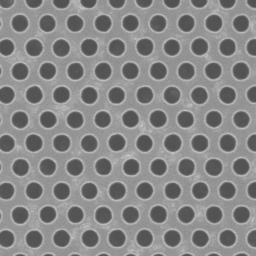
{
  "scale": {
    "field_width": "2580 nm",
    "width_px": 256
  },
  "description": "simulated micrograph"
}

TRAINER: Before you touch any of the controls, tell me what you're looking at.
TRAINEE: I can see a regular array of holes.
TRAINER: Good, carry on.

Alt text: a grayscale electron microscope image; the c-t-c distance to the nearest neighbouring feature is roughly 272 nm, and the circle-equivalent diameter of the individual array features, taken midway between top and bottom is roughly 165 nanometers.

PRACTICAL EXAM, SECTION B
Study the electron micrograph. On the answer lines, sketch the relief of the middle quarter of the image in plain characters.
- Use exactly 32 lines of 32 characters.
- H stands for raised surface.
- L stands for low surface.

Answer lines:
HLLLHHHHLLLLHHHLLLHHHHLLLHHHHLLL
HLLLLHHHLLLLHHLLLLLHHHLLLLHHHLLL
HLLLLHHHLLLLHHHLLLHHHHLLLLHHHLLL
HHLLHHHHHLLHHHHHLLHHHHLLLHHHHLLL
HHHHHHHHHHHHHHHHHHHHHHHHHHHHHHHH
HHHHHHHHHHHHHHHHHHHHHHHHHHHHHHHH
LHHHHLLLHHHHLLLHHHHLLLHHHLLLLHHH
LHHHLLLLHHHLLLLHHHLLLLHHHLLLLHHH
LHHHLLLLHHHLLLLHHHLLLLHHHLLLLHHH
HHHHHLLLHHHHLLHHHHHLLHHHHHLLHHHH
HHHHHHHHHHHHHHHHHHHHHHHHHHHHHHHH
HHHHHHHHHHHHHHHHHHHHHHHHHHHHHHHH
HHLLHHHHLLLHHHHLLLHHHHLLLHHHHLLL
HLLLLHHHLLLLHHLLLLLHHLLLLLHHLLLL
HLLLLHHHLLLLHHHLLLLHHHLLLHHHHLLL
HLLLHHHHHLLHHHHHLLHHHHHLLHHHHLLL
HHHHHHHHHHHHHHHHHHHHHHHHHHHHHHHH
HHHHHHHHHHHHHLHHHHHHHHHHHHHHHHHH
LHHHHLLLHHHHLLLHHHHLLHHHHLLLLHHH
LLHHLLLLHHHLLLLHHHLLLLHHHLLLLHHH
LHHHLLLLHHHLLLLHHHLLLLHHHLLLLHHH
LHHHHLLLHHHHLLHHHHHLLHHHHHLLHHHH
HHHHHHHHHHHHHHHHHHHHHHHHHHHHHHHH
HHHHHHHHHHHHHHHHHHHHHHHHHHHHHHHH
HLLLHHHHLLLLHHHLLLHHHHLLLHHHHLLL
HLLLLHHHLLLLHHHLLLLHHHLLLHHHHLLL
HLLLLHHHLLLLHHHLLLLHHHLLLHHHHLLL
HHLLHHHHHLLHHHHLLLHHHHHLLHHHHHLL
HHHHHHHHHHHHHHHHHHHHHHHHHHHHHHHH
HHHHHHHHHHHHHHHHHHHHHHHHHHHHHHHH
LHHHHLLLHHHHLLLHHHHLLLHHHLLLLHHH
LLHHLLLLHHHLLLLHHHLLLLHHHLLLLHHH